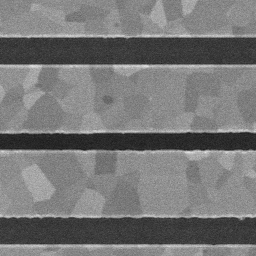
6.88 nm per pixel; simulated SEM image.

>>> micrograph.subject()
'lines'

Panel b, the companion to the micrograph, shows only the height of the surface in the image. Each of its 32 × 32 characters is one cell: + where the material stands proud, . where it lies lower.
++++++++++++++++++++++++++++++++
++++++++++++++++++++++++++++++++
++++++++++++++++++++++++++++++++
++++++++++++++++++++++++++++++++
++++++++++++++++++++++++++++.+++
................................
................................
................................
++++++++++++++++++++++++++++++++
++++++++++++++++++++++++++++++++
++++++++++++++++++++++++++++++++
++++++++++++++++++++++++++++++++
++++++++++++++++++++++++++++++++
++++++++++++++++++++++++++++++++
++++++++++++++++++++++++++++++++
++++++++++++++++++++++++++++++++
++++++++++++++++++...++.........
................................
................................
++++++++++++++++++++++++++++++++
++++++++++++++++++++++++++++++++
++++++++++++++++++++++++++++++++
++++++++++++++++++++++++++++++++
++++++++++++++++++++++++++++++++
++++++++++++++++++++++++++++++++
++++++++++++++++++++++++++++++++
++++++++++++++++++++++++++++++++
................................
................................
................................
................................
++++++++++++++++++++++++++++++++